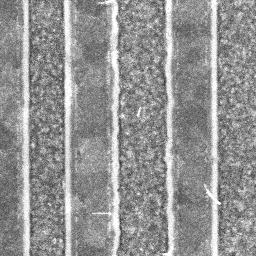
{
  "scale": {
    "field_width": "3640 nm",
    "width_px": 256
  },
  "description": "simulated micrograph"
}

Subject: one or a few lines or trenches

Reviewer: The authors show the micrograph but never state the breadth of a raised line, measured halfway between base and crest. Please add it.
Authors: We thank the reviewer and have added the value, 651 nanometers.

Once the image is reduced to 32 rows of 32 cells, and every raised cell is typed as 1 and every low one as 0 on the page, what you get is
11100000111111000000011111100000
11100000111111000000011111100000
11100000111111000000011111100000
11100000111111000000011111100000
11100000111111000000011111100000
11100000011111000000011111100000
11100000011111000000011111100000
11100000011111000000011111100000
11100000011111000000011111100000
11100000011111100000011111100000
11100000011111000000011111100000
11100000011111000000011111100000
11100000011111000000011111100000
11100000011111000000011111100000
11100000011111000000011111100000
11100000011111000000011111100000
11100000011111000000011111100000
11100000011111000000011111100000
11100000011111000000011111100000
11100000111111000000011111100000
11100000111111000000011111100000
11100000011111000000011111100000
11100000011111000000011111100000
11100000111111000000011111100000
11100000111111100000011111100000
11100000111111000000011111100000
11100000011111000000011111100000
11100000011111000000011111100000
11100000011111100000011111100000
11100000011111100000011111100000
11100000011111000000011111100000
11100000011111000000011111100000